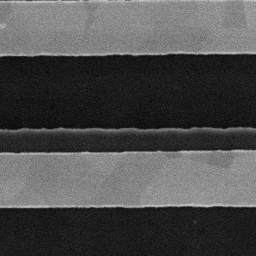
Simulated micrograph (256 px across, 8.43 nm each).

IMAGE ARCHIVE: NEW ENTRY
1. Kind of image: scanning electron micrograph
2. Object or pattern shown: lines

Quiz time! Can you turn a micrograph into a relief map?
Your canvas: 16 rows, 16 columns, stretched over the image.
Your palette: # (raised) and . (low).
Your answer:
################
################
################
................
................
................
................
................
################
################
################
################
################
................
................
................